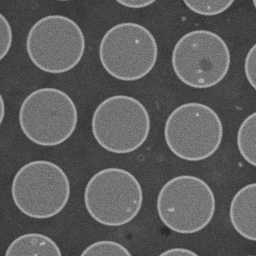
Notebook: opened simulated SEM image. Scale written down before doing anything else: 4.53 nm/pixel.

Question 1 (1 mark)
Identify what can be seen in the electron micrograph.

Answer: an array of small figures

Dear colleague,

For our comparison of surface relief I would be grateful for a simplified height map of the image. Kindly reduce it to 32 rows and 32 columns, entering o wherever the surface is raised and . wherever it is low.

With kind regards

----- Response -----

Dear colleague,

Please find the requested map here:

...............oooo....oooooo...
........................oooo....
o....oooo.......................
o...oooooo....oooo..............
o..ooooooo...oooooo....oooo.....
o..oooooooo..oooooo...oooooo....
o...oooooo..oooooooo..ooooooo..o
....oooooo...oooooo...ooooooo..o
.....oooo....oooooo...ooooooo..o
..............oooo....oooooo...o
.......................oooo....o
....oooo........................
...oooooo....oooo...............
o..oooooo...oooooo....oooo......
..oooooooo..ooooooo..oooooo....o
...oooooo...ooooooo..ooooooo..oo
...oooooo...ooooooo..ooooooo..oo
....oooo....oooooo...ooooooo..oo
.............oooo....oooooo...oo
......................oooo....oo
...oooo........................o
..oooooo....oooo................
..oooooo...oooooo....oooo.......
.oooooooo..ooooooo..oooooo....oo
..ooooooo..ooooooo..ooooooo..ooo
..oooooo...ooooooo..ooooooo..ooo
...oooo....oooooo...ooooooo..ooo
............oooo....oooooo...ooo
.....................oooo....ooo
...ooo........................oo
.oooooo.....ooo.................
.ooooooo..oooooo.....ooo........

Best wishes